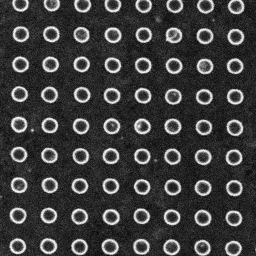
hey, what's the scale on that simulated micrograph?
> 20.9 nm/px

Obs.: a regular array of raised bodies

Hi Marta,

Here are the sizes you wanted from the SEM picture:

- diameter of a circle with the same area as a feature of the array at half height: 298 nm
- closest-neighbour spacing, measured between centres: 625 nanometers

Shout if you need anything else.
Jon